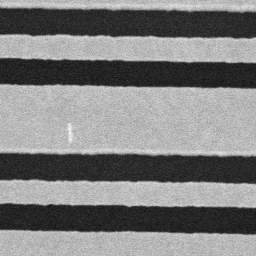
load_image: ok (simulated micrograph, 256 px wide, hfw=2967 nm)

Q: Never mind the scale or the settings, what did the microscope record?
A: lines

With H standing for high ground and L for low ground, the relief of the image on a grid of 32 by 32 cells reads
HHHHHHHHHHHHHHHHHHHHHHHHHHHHHHHH
LLLLLLLLLLLLLLLLLLLLLLLLLLLLLLLL
LLLLLLLLLLLLLLLLLLLLLLLLLLLLLLLL
LLLLLLLLLLLLLLLLLLLLLLLLLLLLLLLL
HHHHHHHHHHHLHLLLLLLLLLLLLLLLLLLL
HHHHHHHHHHHHHHHHHHHHHHHHHHHHHHHH
HHHHHHHHHHHHHHHHHHHHHHHHHHHHHHHH
LLLLLLLLLLLHLHLHHHHHHHHHHHHHHHHH
LLLLLLLLLLLLLLLLLLLLLLLLLLLLLLLL
LLLLLLLLLLLLLLLLLLLLLLLLLLLLLLLL
LLLLLLLLLLLLLLLLLLLLLLLLLLLLLLLL
HHHHHHHHHHHHHHHHHHHHHHHHHHHHHHHH
HHHHHHHHHHHHHHHHHHHHHHHHHHHHHHHH
HHHHHHHHHHHHHHHHHHHHHHHHHHHHHHHH
HHHHHHHHHHHHHHHHHHHHHHHHHHHHHHHH
HHHHHHHHHHHHHHHHHHHHHHHHHHHHHHHH
HHHHHHHHHHHHHHHHHHHHHHHHHHHHHHHH
HHHHHHHHHHHHHHHHHHHHHHHHHHHHHHHH
HHHHHHHHHHHHHHHHHHHHHHHHHHHHHHHH
LLLLLLLLLLLLLLLLLLLLLLLLLLLLLLLL
LLLLLLLLLLLLLLLLLLLLLLLLLLLLLLLL
LLLLLLLLLLLLLLLLLLLLLLLLLLLLLLLL
LHHLLLLLLLLLLLLLLLLLLLLLLLLLLLLL
HHHHHHHHHHHHHHHHHHHHHHHHHHHHHHHH
HHHHHHHHHHHHHHHHHHHHHHHHHHHHHHHH
LLLLHHHHHHHHHHHHHHHHHHHHHHHHHHHH
LLLLLLLLLLLLLLLLLLLLLLLLLLLLLLLL
LLLLLLLLLLLLLLLLLLLLLLLLLLLLLLLL
LLLLLLLLLLLLLLLLLLLLLLLLLLLLLLLL
HHHHHHHHHHHHHHHHHHHHHHHHHHHHHHHH
HHHHHHHHHHHHHHHHHHHHHHHHHHHHHHHH
HHHHHHHHHHHHHHHHHHHHHHHHHHHHHHHH